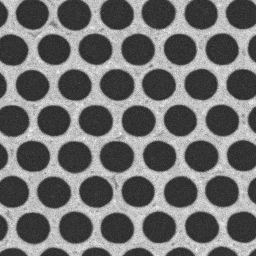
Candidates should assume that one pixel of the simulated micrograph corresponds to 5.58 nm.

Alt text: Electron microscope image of a regular array of holes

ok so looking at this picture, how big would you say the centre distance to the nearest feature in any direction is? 229 nm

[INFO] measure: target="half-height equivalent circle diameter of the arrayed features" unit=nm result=180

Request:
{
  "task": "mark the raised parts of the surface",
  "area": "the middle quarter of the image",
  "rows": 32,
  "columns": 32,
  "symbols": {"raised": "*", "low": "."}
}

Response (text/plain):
********************************
*...********...********..*******
.....*****......*****......****.
......***........***.......***..
.......**.........**........**..
.......**.........**........**..
.......**........***........**..
......****.......***.......****.
.....******.....******....******
********************************
*******..********...*******....*
*****......****.......****......
.***........***.......***.......
..**........***........**.......
..**........**.........**.......
.***........***........**.......
.****......****.......****......
******....******.....******....*
********************************
*...********...*******...*******
......****......*****......****.
......***........***........***.
.......**........***........**..
.......**.........**........**..
.......**........***........***.
......****.......****......****.
.....******.....******....******
********************************
******....******....*******....*
*****......****......*****......
.***........***.......***.......
..**........**.........**.......